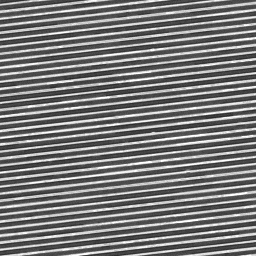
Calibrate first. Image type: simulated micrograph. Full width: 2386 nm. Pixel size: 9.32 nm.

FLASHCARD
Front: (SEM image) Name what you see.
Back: parallel lines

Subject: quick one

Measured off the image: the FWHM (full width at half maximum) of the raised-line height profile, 16.2 nm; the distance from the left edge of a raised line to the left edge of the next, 6.95 px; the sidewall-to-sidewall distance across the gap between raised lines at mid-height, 46.3 nanometers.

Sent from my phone